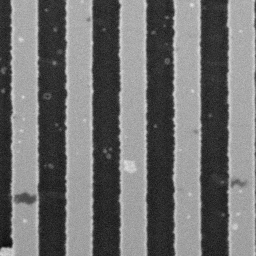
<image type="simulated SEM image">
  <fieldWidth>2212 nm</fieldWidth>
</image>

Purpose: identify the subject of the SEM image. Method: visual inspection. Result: lines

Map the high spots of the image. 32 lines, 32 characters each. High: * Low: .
.****...***....***....***....***
..***...***....***....***....***
.****...***....***....***....***
..***...***....***....***....***
.****...***....***....***....***
.****...****...***....***....***
.****...***....***....***....***
.****...***....***....***....***
.****...***....***....***....***
..***...***....***....***....***
.****...***....***....***....***
.****...****...***....***....***
..***...***....***....***....***
..***...***....***....***....***
..***...***....***....***....***
..***...***....***....***....***
..***...****...***....***....***
..***...***....***....***....***
.****...****...***....***....***
..***...****...***....***....***
..***...****...***....***....***
..***...****...***....***....***
..***...****...***....***....***
.****...****...***....***....***
..***...***....***....***....***
..***...****...***....***....***
..***...****...***....***....***
..***...****...***....***....***
..***...***....***....***....***
..***...***....***....***....***
..***...****...***....***....***
*****...***....***....***....***